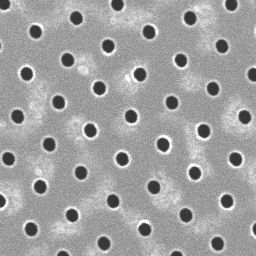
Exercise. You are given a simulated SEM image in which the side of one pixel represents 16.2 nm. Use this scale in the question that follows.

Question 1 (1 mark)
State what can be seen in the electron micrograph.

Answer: a regular array of holes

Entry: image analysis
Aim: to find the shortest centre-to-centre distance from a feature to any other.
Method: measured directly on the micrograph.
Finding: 42.5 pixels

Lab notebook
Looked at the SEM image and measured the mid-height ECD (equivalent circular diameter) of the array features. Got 222 nanometres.